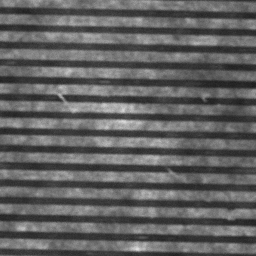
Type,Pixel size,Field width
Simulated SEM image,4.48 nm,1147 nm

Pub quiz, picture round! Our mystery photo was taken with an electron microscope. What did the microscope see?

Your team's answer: parallel lines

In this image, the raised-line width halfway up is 9.87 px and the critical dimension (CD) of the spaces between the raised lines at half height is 32.4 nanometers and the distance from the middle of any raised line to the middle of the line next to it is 77.1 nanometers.